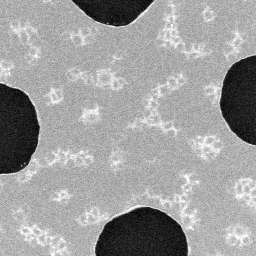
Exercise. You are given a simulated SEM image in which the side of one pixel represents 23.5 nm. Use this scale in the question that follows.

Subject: holes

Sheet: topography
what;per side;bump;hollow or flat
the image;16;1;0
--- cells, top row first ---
1111100001111111
1111110011111111
1111111111111111
1111111111111111
1111111111111100
0111111111111100
0011111111111100
0011111111111100
0011111111111110
0011111111111111
0111111111111111
1111111111111111
1111111111111111
1111111000011111
1111110000011111
1111110000001111